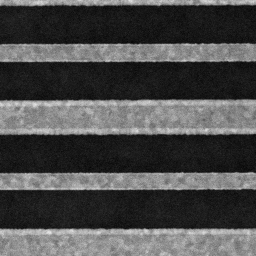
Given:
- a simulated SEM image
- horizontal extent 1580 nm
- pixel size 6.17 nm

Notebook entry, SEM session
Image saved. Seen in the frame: lines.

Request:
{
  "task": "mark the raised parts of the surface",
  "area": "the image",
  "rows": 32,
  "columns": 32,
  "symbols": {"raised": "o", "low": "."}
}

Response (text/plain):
ooooo.o....oo...................
................................
................................
................................
................................
.........................o.ooooo
oooooooooooooooooooooooooooooooo
oooooooooooooooooooooooooooooooo
................................
................................
................................
................................
................................
oooooooooooooooooooooooooooooooo
oooooooooooooooooooooooooooooooo
oooooooooooooooooooooooooooooooo
oooooooooooooooooooooooooooooooo
................................
................................
................................
................................
................................
oooooooooooooooooooooooooooooooo
oooooooooooooooooooooooooooooooo
................................
................................
................................
................................
................................
oooooooooooooooooooooooooooooooo
oooooooooooooooooooooooooooooooo
oooooooooooooooooooooooooooooooo